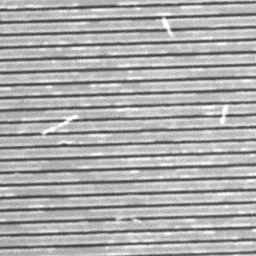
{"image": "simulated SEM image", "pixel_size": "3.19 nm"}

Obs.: parallel lines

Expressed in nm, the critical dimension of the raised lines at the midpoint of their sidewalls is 29.5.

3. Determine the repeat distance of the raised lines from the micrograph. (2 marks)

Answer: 39.9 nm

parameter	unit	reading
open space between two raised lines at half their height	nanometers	10.8